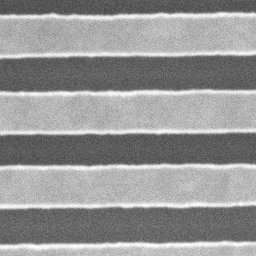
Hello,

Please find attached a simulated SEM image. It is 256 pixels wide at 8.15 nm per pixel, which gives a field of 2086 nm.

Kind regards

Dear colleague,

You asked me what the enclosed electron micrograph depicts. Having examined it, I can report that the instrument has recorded lines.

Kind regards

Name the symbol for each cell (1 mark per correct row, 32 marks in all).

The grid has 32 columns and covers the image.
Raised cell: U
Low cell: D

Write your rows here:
DDDDDDDDDDDDDDDDDDDDDDDDDDDDDDDD
DDDDDDDDDDDDDDDDDDDDDDDDDDDDDDDD
UUUUUUUUUUUUUUUUUUUUUUUUUUUUUUUU
UUUUUUUUUUUUUUUUUUUUUUUUUUUUUUUU
UUUUUUUUUUUUUUUUUUUUUUUUUUUUUUUU
UUUUUUUUUUUUUUUUUUUUUUUUUUUUUUUU
UUUUUUUUUUUUUUUUUUUUUUUUUUUUUUUU
DDDDDDDDDDDDDDDDDDDDDDDDDDDDDDDD
DDDDDDDDDDDDDDDDDDDDDDDDDDDDDDDD
DDDDDDDDDDDDDDDDDDDDDDDDDDDDDDDD
DDDDDDDDDDDDDDDDDDDDDDDDDDDDDDDD
DDDDDDDDDDDDDDDDUUUUUDUUUUUUUUUU
UUUUUUUUUUUUUUUUUUUUUUUUUUUUUUUU
UUUUUUUUUUUUUUUUUUUUUUUUUUUUUUUU
UUUUUUUUUUUUUUUUUUUUUUUUUUUUUUUU
UUUUUUUUUUUUUUUUUUUUUUUUUUUUUUUU
UUUUUUUUUUUUUUUUUUUUUUUUUUUUDDDD
DDDDDDDDDDDDDDDDDDDDDDDDDDDDDDDD
DDDDDDDDDDDDDDDDDDDDDDDDDDDDDDDD
DDDDDDDDDDDDDDDDDDDDDDDDDDDDDDDD
DDDDDDDDDDDDDDDDDDDDDDDDDDDDDDDD
UUUUUUUUUUUUUUUUUUUUUUUUUUUUUUUU
UUUUUUUUUUUUUUUUUUUUUUUUUUUUUUUU
UUUUUUUUUUUUUUUUUUUUUUUUUUUUUUUU
UUUUUUUUUUUUUUUUUUUUUUUUUUUUUUUU
UUUUUUUUUUUUUUUUUUUUUUUUUUUUUUUU
DDDDDDDDDDDDDDDDDDDDDDDDDDDDDDDD
DDDDDDDDDDDDDDDDDDDDDDDDDDDDDDDD
DDDDDDDDDDDDDDDDDDDDDDDDDDDDDDDD
DDDDDDDDDDDDDDDDDDDDDDDDDDDDDDDD
DDDDDDDDDDDDDUUUUUUDUUUUUUUUUUUU
UUUUUUUUUUUUUUUUUUUUUUUUUUUUUUUU